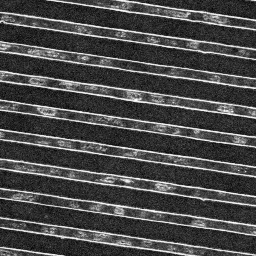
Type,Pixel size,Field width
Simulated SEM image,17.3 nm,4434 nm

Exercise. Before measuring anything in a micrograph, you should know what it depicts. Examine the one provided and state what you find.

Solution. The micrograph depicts parallel lines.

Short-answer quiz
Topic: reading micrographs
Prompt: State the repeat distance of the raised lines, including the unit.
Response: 503 nanometers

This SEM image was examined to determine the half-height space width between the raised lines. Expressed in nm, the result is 324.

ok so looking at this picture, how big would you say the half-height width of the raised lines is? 169 nm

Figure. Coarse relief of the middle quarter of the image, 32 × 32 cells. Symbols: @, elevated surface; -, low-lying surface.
---------@@@@@@@@@@@@@@@--------
---------------@@@@@@@@@@@@@@@@@
----------------------@@@@@@@@@@
-------------------------------@
@@@-----------------------------
@@@@@@@@@@----------------------
-@@@@@@@@@@@@@@@@---------------
-------@@@@@@@@@@@@@@@@---------
-------------@@@@@@@@@@@@@@@@@--
--------------------@@@@@@@@@@@@
----------------------------@@@@
--------------------------------
@@@@@@@-------------------------
@@@@@@@@@@@@@@------------------
-----@@@@@@@@@@@@@@@@-----------
------------@@@@@@@@@@@@@@@@----
-------------------@@@@@@@@@@@@@
-------------------------@@@@@@@
--------------------------------
@@@@@@--------------------------
@@@@@@@@@@@---------------------
--@@@@@@@@@@@@@@@@--------------
---------@@@@@@@@@@@@@@@@-------
----------------@@@@@@@@@@@@@@@@
-----------------------@@@@@@@@@
------------------------------@@
@@@-----------------------------
@@@@@@@@@@----------------------
@@@@@@@@@@@@@@@@@---------------
------@@@@@@@@@@@@@@@@@@--------
-------------@@@@@@@@@@@@@@@@---
--------------------@@@@@@@@@@@@